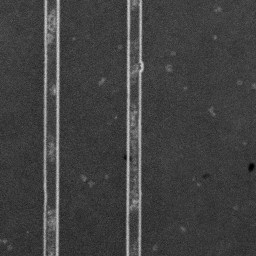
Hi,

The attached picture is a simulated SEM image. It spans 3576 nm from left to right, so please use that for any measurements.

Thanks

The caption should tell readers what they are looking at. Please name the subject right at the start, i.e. one or a few lines or trenches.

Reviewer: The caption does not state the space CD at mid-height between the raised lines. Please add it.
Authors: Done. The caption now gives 964 nm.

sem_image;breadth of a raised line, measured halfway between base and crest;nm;182